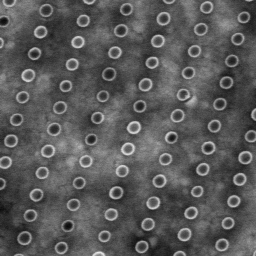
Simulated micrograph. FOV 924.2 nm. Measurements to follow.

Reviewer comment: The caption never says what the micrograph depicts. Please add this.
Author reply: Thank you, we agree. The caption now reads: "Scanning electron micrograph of a regular array of raised bodies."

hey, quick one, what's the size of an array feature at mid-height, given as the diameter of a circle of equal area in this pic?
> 42.8 nm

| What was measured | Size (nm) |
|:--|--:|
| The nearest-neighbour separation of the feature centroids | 80.7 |